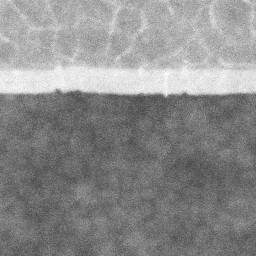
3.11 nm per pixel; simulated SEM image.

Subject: one or a few lines or trenches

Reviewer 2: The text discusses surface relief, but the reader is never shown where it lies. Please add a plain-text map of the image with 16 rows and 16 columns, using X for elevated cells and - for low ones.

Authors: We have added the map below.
XXXXXXXXXXXXXXXX
XXXXXXXXXXXXXXXX
XXXXXXXXXXXXXXXX
XXXXXXXXXXXXXXXX
XXXXXXXXXXXXXXXX
----------------
----------------
----------------
----------------
----------------
----------------
----------------
----------------
----------------
----------------
----------------